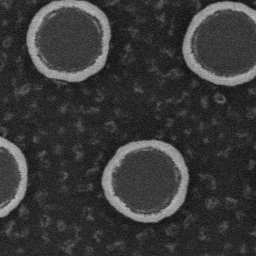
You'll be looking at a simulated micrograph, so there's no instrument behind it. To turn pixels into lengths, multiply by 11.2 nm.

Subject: raised bodies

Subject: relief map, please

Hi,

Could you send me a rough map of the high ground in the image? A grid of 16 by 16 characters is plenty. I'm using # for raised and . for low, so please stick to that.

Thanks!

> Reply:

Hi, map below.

...###.......##.
..#####.....####
..#####.....####
..####......####
...##........###
................
................
................
................
#.......###.....
#......####.....
#......####.....
#......####.....
........##......
................
................